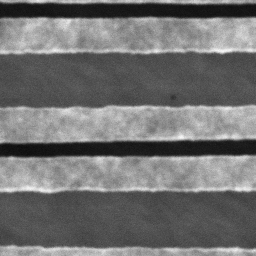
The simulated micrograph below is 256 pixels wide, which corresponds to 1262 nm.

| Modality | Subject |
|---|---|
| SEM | lines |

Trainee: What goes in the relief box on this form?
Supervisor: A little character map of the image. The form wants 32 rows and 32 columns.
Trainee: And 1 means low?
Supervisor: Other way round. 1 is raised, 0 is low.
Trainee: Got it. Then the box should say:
00000000000000000000000000000000
00000000000000000000000000000000
11111111111111111111111111111111
11111111111111111111111111111111
11111111111111111111111111111111
11111111111111111111111111111111
11111111110111011111000001110000
00000000000000000000000000000000
00000000000000000000000000000000
00000000000000000000000000000000
00000000000000000000000000000000
00000000000000000000000000000000
00000000000000000000000000000000
00100000010001111111100111111111
11111111111111111111111111111111
11111111111111111111111111111111
11111111111111111111111111111111
11111111111111111111110010000000
00000000000000000000000000000000
00000000000000000000000000000000
11111111111111111111111111111111
11111111111111111111111111111111
11111111111111111111111111111111
11111111111111111111111111111111
00000000000000000000000000000000
00000000000000000000000000000000
00000000000000000000000000000000
00000000000000000000000000000000
00000000000000000000000000000000
00000000000000000000000000000000
00000000000000000000000000000000
11111111111111111111111111111111